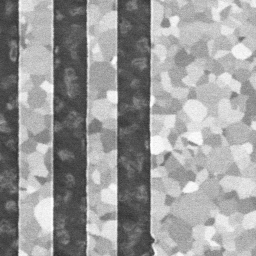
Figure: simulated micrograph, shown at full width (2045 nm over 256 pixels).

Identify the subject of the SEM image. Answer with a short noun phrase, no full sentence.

one or a few lines or trenches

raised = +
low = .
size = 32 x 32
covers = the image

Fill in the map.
..+++++....+++.....+++++++++++++
..+++++....+++.....+++++++++++++
..+++++....+++.....+++++++++++++
..+++++....++++....+++++++++++++
..+++++....++++....+++++++++++++
..+++++....++++....+++++++++++++
..+++++....+++.....+++++++++++++
..+++++....+++.....+++++++++++++
..+++++....+++.....+++++++++++++
..+++++....+++.....+++++++++++++
..+++++....+++.....+++++++++++++
..+++++....+++.....+++++++++++++
..+++++....++++....+++++++++++++
..+++++....+++.....+++++++++++++
..+++++....+++.....+++++++++++++
..+++++....++++....+++++++++++++
..+++++....++++....+++++++++++++
..+++++....+++.....+++++++++++++
..+++++....++++....+++++++++++++
..+++++....++++....+++++++++++++
..+++++....+++.....+++++++++++++
..++++.....++++....+++++++++++++
..++++.....++++....+++++++++++++
..++++.....+++.....+++++++++++++
..++++.....++++....+++++++++++++
..++++.....++++....+++++++++++++
..++++.....++++....+++++++++++++
..++++.....++++....+++++++++++++
..++++.....+++.....+++++++++++++
..++++.....+++.....+++++++++++++
..++++.....+++.....+++++++++++++
..++++.....++++....+++++++++++++